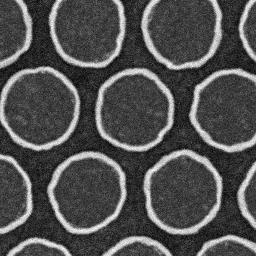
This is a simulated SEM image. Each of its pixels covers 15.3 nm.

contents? raised bodies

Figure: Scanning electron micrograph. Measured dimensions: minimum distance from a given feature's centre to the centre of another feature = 1450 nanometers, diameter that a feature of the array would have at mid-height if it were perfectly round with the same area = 1.16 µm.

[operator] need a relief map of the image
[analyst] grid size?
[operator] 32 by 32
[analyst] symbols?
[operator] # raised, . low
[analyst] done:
###....########....########....#
###....########...#########....#
###....########...#########...##
####...########...#########...##
####...########...#########...##
###....########....########....#
###.....#######....#######.....#
#........#####......######......
................................
..######.......####........####.
.########....#######.....#######
.########....########....#######
##########...########...########
##########..#########...########
##########..#########...########
.########...#########...########
.########....########....#######
..######......######......######
....#...........##..........##..
..........###........###........
##......######......######......
###....########....########....#
####...########...#########....#
####..#########...#########...##
####..#########....########...##
####...########....########...##
####...########....########....#
###.....######.....#######.....#
#........###.........####.......
................................
...###.........#####......#####.
..######......#######....#######